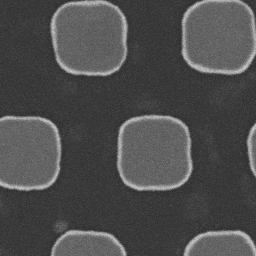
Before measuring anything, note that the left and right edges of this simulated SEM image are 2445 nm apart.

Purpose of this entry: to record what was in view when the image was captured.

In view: raised bodies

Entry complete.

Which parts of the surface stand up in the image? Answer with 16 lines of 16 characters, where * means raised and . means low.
....***.....***.
...*****...*****
...*****...*****
....****....****
.....**.......*.
................
................
***.....***.....
****....****....
****...*****....
****...*****....
***.....***.....
................
................
................
...*****....****